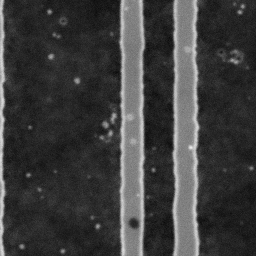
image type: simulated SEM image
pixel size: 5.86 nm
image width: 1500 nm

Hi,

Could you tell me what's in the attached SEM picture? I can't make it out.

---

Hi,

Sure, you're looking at lines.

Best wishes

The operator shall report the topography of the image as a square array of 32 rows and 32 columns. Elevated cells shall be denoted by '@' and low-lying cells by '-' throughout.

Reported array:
---------------@@@----@@@-------
---------------@@@----@@@-------
---------------@@@----@@@-------
---------------@@@----@@--------
---------------@@@----@@@-------
---------------@@@----@@@-------
---------------@@@----@@--------
---------------@@@----@@--------
---------------@@@----@@@-------
@--------------@@@----@@@-------
---------------@@@----@@@-------
---------------@@@----@@@-------
---------------@@@----@@@-------
---------------@@@----@@@-------
---------------@@@----@@@-------
---------------@@@----@@@-------
---------------@@@----@@@-------
---------------@@@----@@@-------
---------------@@@----@@@-------
---------------@@@----@@@-------
---------------@@@----@@@-------
---------------@@@----@@@-------
---------------@@@----@@@-------
---------------@@@----@@@-------
---------------@@@----@@@-------
---------------@@@----@@@-------
---------------@@@----@@@-------
---------------@@@----@@@-------
---------------@@@----@@@-------
---------------@@@----@@@-------
---------------@@@----@@@-------
---------------@@@----@@@-------